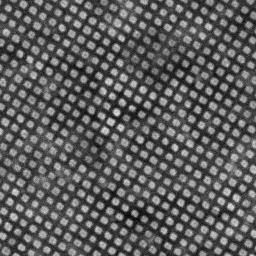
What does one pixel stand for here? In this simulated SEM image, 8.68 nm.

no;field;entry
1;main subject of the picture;a regular array of raised bodies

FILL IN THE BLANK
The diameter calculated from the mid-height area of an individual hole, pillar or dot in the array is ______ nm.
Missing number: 54.6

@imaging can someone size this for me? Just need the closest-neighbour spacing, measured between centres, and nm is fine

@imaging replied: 94.4